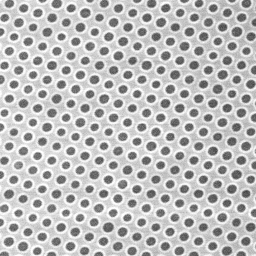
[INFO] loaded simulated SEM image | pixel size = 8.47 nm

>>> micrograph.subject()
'a regular array of holes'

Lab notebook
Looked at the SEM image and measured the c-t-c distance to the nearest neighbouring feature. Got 0.126 micrometres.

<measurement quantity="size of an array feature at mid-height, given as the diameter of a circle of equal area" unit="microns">0.085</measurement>